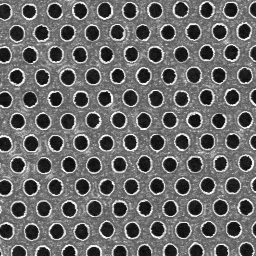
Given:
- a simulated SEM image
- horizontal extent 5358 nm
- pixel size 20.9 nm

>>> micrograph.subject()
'a regular array of holes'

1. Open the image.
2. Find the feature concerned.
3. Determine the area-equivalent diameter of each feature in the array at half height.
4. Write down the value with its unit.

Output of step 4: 299 nm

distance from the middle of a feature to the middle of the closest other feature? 516 nanometres